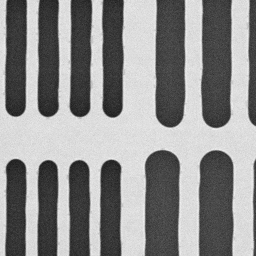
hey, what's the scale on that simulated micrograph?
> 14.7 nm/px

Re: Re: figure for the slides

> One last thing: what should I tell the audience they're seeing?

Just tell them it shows groups of lines, slits or small figures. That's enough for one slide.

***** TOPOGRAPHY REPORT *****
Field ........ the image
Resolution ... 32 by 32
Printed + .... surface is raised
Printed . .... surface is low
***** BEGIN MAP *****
+..++..++...+...+++....++....++.
+..++..++...+...+++....++....++.
+..++..++...+...+++....++....++.
+..++..++...+..++++....++....++.
+..++..++..++..++++....++....++.
+..++..++..++..++++....++....++.
+..++..++...+...+++....++....++.
+..++..++...+...+++....++....++.
+..++..++..++..++++....++....++.
+..++..++..++..++++....++....++.
+..++..++..++..++++....++....++.
+..++..++..++..++++....++....++.
+..++..++..++..++++....++....++.
+..++..++..++..++++....++....++.
+.+++..++..++..++++....++....++.
++++++++++++++++++++..++++..++++
++++++++++++++++++++++++++++++++
++++++++++++++++++++++++++++++++
++++++++++++++++++++++++++++++++
+++++++++++++++++++...+++....+++
+..++..++..++..+++.....++....+++
+..++..++..++..+++.....++....+++
+..++..++..+...+++.....++....+++
+..++..++..+...+++.....++....+++
+..++..++..+...+++.....++....+++
+..++..++..+...+++.....++....+++
+..++..++..+...+++.....++....+++
+..++..++..+...+++....+++....+++
+..++..++..+...+++....+++....+++
+..++..++..+...+++....+++....+++
+..++..++..+...+++....+++....+++
+..++..++..+...+++....+++....+++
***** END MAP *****